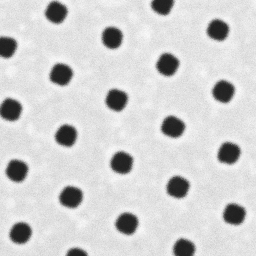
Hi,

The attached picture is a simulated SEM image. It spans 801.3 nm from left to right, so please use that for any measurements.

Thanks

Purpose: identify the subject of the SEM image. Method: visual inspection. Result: a regular array of holes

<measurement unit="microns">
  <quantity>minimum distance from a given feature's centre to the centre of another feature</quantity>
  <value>0.191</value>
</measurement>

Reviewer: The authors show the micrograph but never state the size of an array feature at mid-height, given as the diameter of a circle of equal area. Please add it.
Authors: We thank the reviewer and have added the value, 74.1 nm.